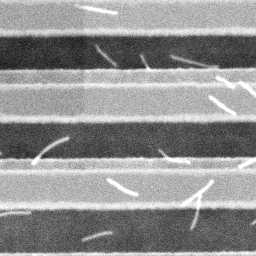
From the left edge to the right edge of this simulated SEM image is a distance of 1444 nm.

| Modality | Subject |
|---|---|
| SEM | lines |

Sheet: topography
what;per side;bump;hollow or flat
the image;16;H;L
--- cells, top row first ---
HHHHHHHHHHHHHHHH
HHHHHHHHHHHHHHHH
LLLLLLLLLLLLLLLL
LLLLLLLLLLLLLLLL
HHHHHHHHHHHHHHHH
HHHHHHHHHHHHHHHH
HHHHHHHHHHHHHHHH
LLLLLLLLLLLLLLLL
LLLLLLLLLLLLLLLL
LLLLLLLLLLLLLLLL
HHHHHHHHHHHHHHHH
HHHHHHHHHHHHHHHH
HHHHHHHHHHHHHHHH
LLLLLLLLLLLLLLLL
LLLLLLLLLLLLLLLL
LLLLLLLLLLLLLLLL